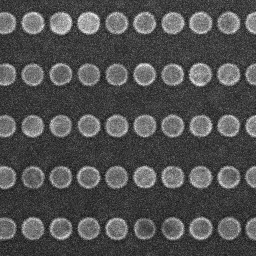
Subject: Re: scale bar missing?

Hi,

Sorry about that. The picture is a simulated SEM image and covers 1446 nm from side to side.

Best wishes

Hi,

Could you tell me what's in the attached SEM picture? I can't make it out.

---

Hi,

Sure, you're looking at a regular array of raised bodies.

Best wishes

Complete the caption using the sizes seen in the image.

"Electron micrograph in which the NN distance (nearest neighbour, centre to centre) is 0.158 micrometres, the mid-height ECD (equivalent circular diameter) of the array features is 119 nm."